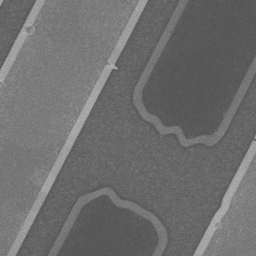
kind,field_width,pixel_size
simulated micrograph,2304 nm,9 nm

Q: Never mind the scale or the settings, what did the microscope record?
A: one or a few lines or trenches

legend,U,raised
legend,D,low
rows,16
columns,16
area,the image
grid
DDUUUUUUUDDUUUUU
DDUUUUUUDDDUUUUU
DUUUUUUUDDUUUUUU
DUUUUUUDDDUUUUUU
UUUUUUUDDUUUUUUU
UUUUUUDDDUUUUUUD
UUUUUUDDDUUUUUUD
UUUUUDDDDDUUUUDD
UUUUUDDDDDDUUUDD
UUUUDDDDDDDDDDDD
UUUUDDDDDDDDDDDU
UUUDDDDDDDDDDDDU
UUUDDUUDDDDDDDUU
UUDDDUUUUDDDDDUU
UDDDUUUUUUDDDUUU
UDDDUUUUUUDDDUUU